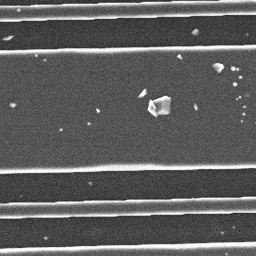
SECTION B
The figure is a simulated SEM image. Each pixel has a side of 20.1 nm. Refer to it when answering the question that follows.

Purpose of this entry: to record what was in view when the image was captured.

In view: lines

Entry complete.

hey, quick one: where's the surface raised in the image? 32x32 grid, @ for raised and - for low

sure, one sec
------------@@@@@@@@@@@@@@@@@@@@
@@@@@@@@@@@@@@@@@@@@@@@@@@@@@@@@
@@------------------------------
--------------------------------
--------------------------------
--------------------------------
---@@@@@@@@@@@@@@@@@@@@@@@@@@@@@
@@@@@@@@@@@@@@@@@@@@@@@@@@@@@@@@
@@@@@@@@@@@@@@@@@@@@@@@@@@@@@@@@
@@@@@@@@@@@@@@@@@@@@@@@@@@@@@@@@
@@@@@@@@@@@@@@@@@@@@@@@@@@@@@@@@
@@@@@@@@@@@@@@@@@@@@@@@@@@@@@@@@
@@@@@@@@@@@@@@@@@@@@@@@@@@@@@@@@
@@@@@@@@@@@@@@@@@@@@@@@@@@@@@@@@
@@@@@@@@@@@@@@@@@@@@@@@@@@@@@@@@
@@@@@@@@@@@@@@@@@@@@@@@@@@@@@@@@
@@@@@@@@@@@@@@@@@@@@@@@@@@@@@@@@
@@@@@@@@@@@@@@@@@@@@@@@@@@@@@@@@
@@@@@@@@@@@@@@@@@@@@@@@@@@@@@@@@
@@@@@@@@@@@@@@@@@@@@@@@@@@@@@@@@
@@@@@@@@@@@@@@@@@@@@@@@@@@@@@@@@
@-------------------------------
--------------------------------
--------------------------------
--------------------------------
-@@@@@@@@@@@@@@@@@@@@@@@@@@@@@@@
@@@@@@@@@@@@@@@@@@@@@@@@@@@@@---
--------------------------------
--------------------------------
--------------------------------
--------------------------------
@@@@@@@@@@@@@@@@@@@@@@@@@@@@@@@@